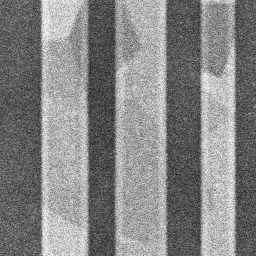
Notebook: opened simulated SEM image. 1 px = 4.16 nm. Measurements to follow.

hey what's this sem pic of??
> one or a few lines or trenches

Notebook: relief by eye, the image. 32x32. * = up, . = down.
......*****....*****.....****...
......*****....*****.....****...
......*****....*****.....****...
......*****....*****.....****...
......*****....*****.....****...
......*****....*****.....****...
......*****....*****.....****...
......*****....*****.....****...
......*****....*****.....****...
......*****....*****.....****...
......*****....*****.....****...
......*****....*****......***...
......*****....*****......***...
......*****....*****.....****...
......*****....*****.....****...
......*****....*****.....****...
......*****....*****.....****...
......*****....*****.....****...
......*****....*****.....****...
......*****....*****.....****...
......*****....*****.....****...
......*****....*****.....****...
......*****....*****.....****...
......*****....*****.....****...
......*****....*****......***...
......*****....*****......***...
......*****....*****......***...
......*****....*****......***...
......*****....*****......***...
......*****....*****......***...
......*****....*****......***...
......*****....*****......***...